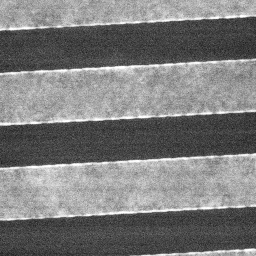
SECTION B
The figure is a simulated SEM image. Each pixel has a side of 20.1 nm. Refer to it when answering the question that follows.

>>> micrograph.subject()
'lines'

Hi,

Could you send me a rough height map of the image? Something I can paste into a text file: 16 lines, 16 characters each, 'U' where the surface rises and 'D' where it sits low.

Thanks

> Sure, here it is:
UUUUUUUUUUUUUUUU
UUUUUUUDDDDDDDDD
DDDDDDDDDDDDDDDD
DDDDDDDDDDDDDDDD
DDUUUUUUUUUUUUUU
UUUUUUUUUUUUUUUU
UUUUUUUUUUUUUUUU
UUUUUUDDDDDDDDDD
DDDDDDDDDDDDDDDD
DDDDDDDDDDDDDDDD
UUUUUUUUUUUUUUUU
UUUUUUUUUUUUUUUU
UUUUUUUUUUUUUUUU
UUUUUDDDDDDDDDDD
DDDDDDDDDDDDDDDD
DDDDDDDDDDDDDDDD